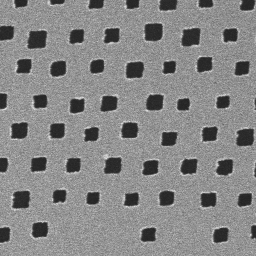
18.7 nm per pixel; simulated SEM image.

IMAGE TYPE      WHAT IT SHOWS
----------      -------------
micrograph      a regular array of holes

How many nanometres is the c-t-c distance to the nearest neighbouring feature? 645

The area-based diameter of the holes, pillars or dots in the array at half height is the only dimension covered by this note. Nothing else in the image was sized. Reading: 302 nm